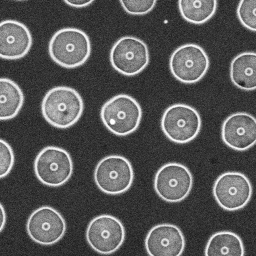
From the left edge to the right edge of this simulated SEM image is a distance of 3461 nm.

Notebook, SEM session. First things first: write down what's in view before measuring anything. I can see an array of small figures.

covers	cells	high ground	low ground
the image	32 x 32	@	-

@@@@@@@@@--@@@@----@@@@----@@@--
@@@@@@@@@@@@@@@@--@@@@@----@@@--
@@@@@@@@@@@@@@@@@@@@@@@@--@@@@--
---@@@@@@@@@@@@@@@@@@@@@@@@@@@@-
----@@@----@@@@@@@@@@@@@@@@@@@@@
----@@-----@@@@---@@@@@@@@@@@@@@
---@@@-----@@@----@@@@---@@@@@@@
@@@@@@@---@@@@----@@@@----@@@---
@@@@@@@@@@@@@@@---@@@@----@@@---
@@@@@@@@@@@@@@@@@@@@@@---@@@@---
-@@@@@@@@@@@@@@@@@@@@@@@@@@@@@--
--@@@@---@@@@@@@@@@@@@@@@@@@@@@@
---@@@----@@@@--@@@@@@@@@@@@@@@@
--@@@-----@@@----@@@@@--@@@@@@@@
-@@@@@----@@@----@@@@----@@@@--@
@@@@@@@--@@@@----@@@-----@@@----
@@@@@@@@@@@@@@--@@@@@----@@@----
@@@@@@@@@@@@@@@@@@@@@@-@@@@@----
-@@@@@@@@@@@@@@@@@@@@@@@@@@@@@-@
-@@@@---@@@@@@@@@@@@@@@@@@@@@@@@
-@@@@----@@@@---@@@@@@@@@@@@@@@@
-@@@@----@@@----@@@@---@@@@@@@@@
@@@@@---@@@@----@@@@----@@@----@
@@@@@@@@@@@@@---@@@@----@@@----@
@@@@@@@@@@@@@@@@@@@@---@@@@----@
@@@@@@@@@@@@@@@@@@@@@@@@@@@@--@@
@@@@@--@@@@@@@@@@@@@@@@@@@@@@@@@
@@@@----@@@@--@@@@@@@@@@@@@@@@@@
@@@@----@@@----@@@@---@@@@@@@@@@
@@@@---@@@@----@@@@----@@@@--@@@
@@@@@@@@@@@----@@@-----@@@----@@
@@@@@@@@@@@@@@@@@@@----@@@----@@